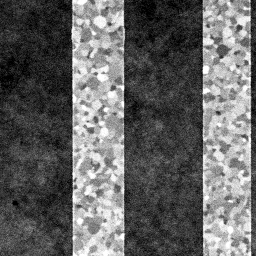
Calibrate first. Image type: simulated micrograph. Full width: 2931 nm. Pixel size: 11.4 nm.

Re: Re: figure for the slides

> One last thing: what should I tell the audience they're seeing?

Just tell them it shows one or a few lines or trenches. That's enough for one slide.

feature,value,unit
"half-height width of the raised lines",0.562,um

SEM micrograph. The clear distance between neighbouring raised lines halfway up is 909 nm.